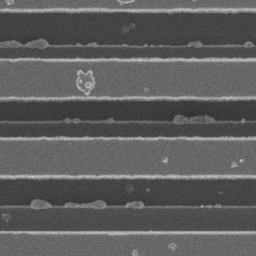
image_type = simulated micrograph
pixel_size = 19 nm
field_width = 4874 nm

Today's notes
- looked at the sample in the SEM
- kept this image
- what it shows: lines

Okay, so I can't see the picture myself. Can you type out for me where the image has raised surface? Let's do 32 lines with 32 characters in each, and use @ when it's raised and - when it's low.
@@@@@@@@@@@@@@@@@@@@@@@@@@@@@@@@
--------------------------------
--------------------------------
--------------------------------
--------------------------------
--------------------------------
--------------------------------
@@@@@@@@@@@@@@@@@@@@@@@@@@@@@@@@
@@@@@@@@@@@@@@@@@@@@@@@@@@@@@@@@
@@@@@@@@@@@@@@@@@@@@@@@@@@@@@@@@
@@@@@@@@@@@@@@@@@@@@@@@@@@@@@@@@
@@@@@@@@@@@@@@@@@@@@@@@@@@@@@@@@
--------------------------------
--------------------------------
--------------------------------
--------------------------------
--------------------------------
@@@@@@@@@@@@@@@@@@@@@@@@@@@@@@@@
@@@@@@@@@@@@@@@@@@@@@@@@@@@@@@@@
@@@@@@@@@@@@@@@@@@@@@@@@@@@@@@@@
@@@@@@@@@@@@@@@@@@@@@@@@@@@@@@@@
@@@@@@@@@@@@@@@@@@@@@@@@@@@@@@@@
--------------------------------
--------------------------------
--------------------------------
--------------------------------
--------------------------------
--------------------------------
--------------------------------
@@@@@@@@@@@@@@@@@@@@@@@@@@@@@@@@
@@@@@@@@@@@@@@@@@@@@@@@@@@@@@@@@
@@@@@@@@@@@@@@@@@@@@@@@@@@@@@@@@